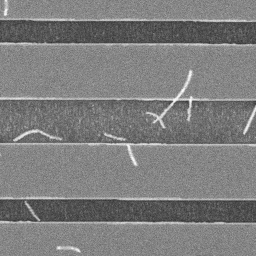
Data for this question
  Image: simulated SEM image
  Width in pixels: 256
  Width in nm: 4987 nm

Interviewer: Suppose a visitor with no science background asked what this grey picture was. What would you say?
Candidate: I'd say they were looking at lines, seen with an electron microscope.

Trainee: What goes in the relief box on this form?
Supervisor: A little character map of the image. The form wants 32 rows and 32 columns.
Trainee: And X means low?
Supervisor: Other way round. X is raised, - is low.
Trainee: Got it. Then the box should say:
XXXXXXXXXXXXXXXXXXXXXXXXXXXXXXXX
XXXXXXXXXXXXXXXXXXXXXXXXXXXXXXXX
----XXXXXXXXXXXXXXXXXXXXXXXXXXXX
--------------------------------
--------------------------------
XXXX----------------------------
XXXXXXXXXXXXXXXXXXXXXXXXXXXXXXXX
XXXXXXXXXXXXXXXXXXXXXXXXXXXXXXXX
XXXXXXXXXXXXXXXXXXXXXXXXXXXXXXXX
XXXXXXXXXXXXXXXXXXXXXXXXXXXXXXXX
XXXXXXXXXXXXXXXXXXXXXXXXXXXXXXXX
XXXXXXXXXXXXXXXXXXXXXXXXXXXXXXXX
---------------------X-X--------
--------------------------------
--------------------------------
--------------------------------
--------------------------------
--------------------------------
XXXXXXXXXXXXXXXXXXXXXXXXXXXXXXXX
XXXXXXXXXXXXXXXXXXXXXXXXXXXXXXXX
XXXXXXXXXXXXXXXXXXXXXXXXXXXXXXXX
XXXXXXXXXXXXXXXXXXXXXXXXXXXXXXXX
XXXXXXXXXXXXXXXXXXXXXXXXXXXXXXXX
XXXXXXXXXXXXXXXXXXXXXXXXXXXXXXXX
XXXXXXXXXXXXXXXXXXXXXXXXXXXXXXXX
--------------------------------
--------------------------------
--------------------------------
XXXXXXXXXXXXXXXXXXXXXXXXXXXXXXXX
XXXXXXXXXXXXXXXXXXXXXXXXXXXXXXXX
XXXXXXXXXXXXXXXXXXXXXXXXXXXXXXXX
XXXXXXXXXXXXXXXXXXXXXXXXXXXXXXXX